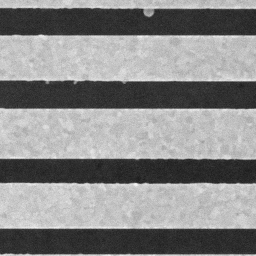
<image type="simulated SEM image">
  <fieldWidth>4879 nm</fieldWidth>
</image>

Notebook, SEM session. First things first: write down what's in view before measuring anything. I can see lines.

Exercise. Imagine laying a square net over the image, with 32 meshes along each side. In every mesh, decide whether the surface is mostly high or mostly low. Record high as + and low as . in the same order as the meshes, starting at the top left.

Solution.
++++++++++++++++++++++++++++++++
................................
................................
................................
.++..+..........................
++++++++++++++++++++++++++++++++
++++++++++++++++++++++++++++++++
++++++++++++++++++++++++++++++++
++++++++++++++++++++++++++++++++
++++++++++++++++++++++++++++++++
................................
................................
................................
................................
++++++++++++++++++++++++++++++++
++++++++++++++++++++++++++++++++
++++++++++++++++++++++++++++++++
++++++++++++++++++++++++++++++++
++++++++++++++++++++++++++++++++
++++++++++++++++++++++++++++++++
................................
................................
................................
++++++++++++++++++++++++++++++++
++++++++++++++++++++++++++++++++
++++++++++++++++++++++++++++++++
++++++++++++++++++++++++++++++++
++++++++++++++++++++++++++++++++
++++++++++++++++++++++++++++++++
................................
................................
................................